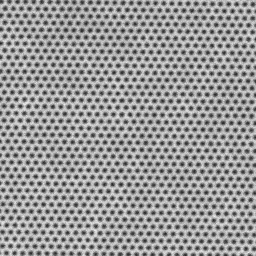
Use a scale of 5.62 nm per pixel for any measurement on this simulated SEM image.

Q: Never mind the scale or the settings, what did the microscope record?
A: a regular array of holes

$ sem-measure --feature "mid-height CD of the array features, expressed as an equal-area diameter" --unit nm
29.8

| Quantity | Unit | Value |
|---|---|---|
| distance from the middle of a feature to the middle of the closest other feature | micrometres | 0.0433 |